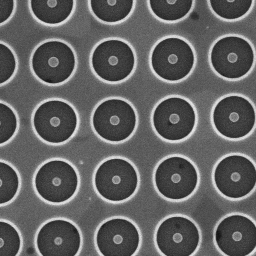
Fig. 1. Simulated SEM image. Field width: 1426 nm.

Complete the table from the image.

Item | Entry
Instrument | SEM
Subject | an array of small figures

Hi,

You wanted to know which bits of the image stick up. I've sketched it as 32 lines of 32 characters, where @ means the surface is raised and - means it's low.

--@@-----@@------@@-----@@------
--@@-----@@@----@@@-----@@@----@
-@@@@---@@@@---@@@@@---@@@@@@@@@
@@@@@@@@@@@@@@@@@@@@@@@@@@@@@@@@
@@@@@@@@@@@@@@@@@@@@@@@@@@@@--@@
-@@@@---@@@@----@@@@----@@@----@
--@@-----@@@-----@@-----@@------
--@@-----@@------@@-----@@------
--@@-----@@------@@-----@@@----@
--@@@----@@@----@@@@---@@@@@---@
@@@@@@-@@@@@@@@@@@@@@@@@@@@@@@@@
@@@@@@@@@@@@@@@@@@@@@@@@@@@@@@@@
@@@@@@-@@@@@@--@@@@@---@@@@----@
-@@@@----@@@-----@@-----@@@-----
--@@------@@-----@@------@@-----
--@@------@@-----@@-----@@@-----
--@@@----@@@-----@@@----@@@----@
-@@@@---@@@@@---@@@@@--@@@@@@@@@
@@@@@@@@@@@@@@@@@@@@@@@@@@@@@@@@
@@@@@@@@@@@@@@@@@@@@@--@@@@@---@
-@@@@----@@@@---@@@@----@@@-----
--@@@-----@@-----@@------@@-----
--@@------@@-----@@------@@-----
--@@------@@-----@@@-----@@-----
--@@@----@@@@---@@@@----@@@@---@
-@@@@@@@@@@@@@@@@@@@@@@@@@@@@@@@
@@@@@@@@@@@@@@@@@@@@@@@@@@@@@@@@
@@@@@@@-@@@@@---@@@@----@@@@---@
--@@@-----@@-----@@@-----@@-----
---@@-----@@-----@@------@@-----
---@@-----@@-----@@------@@-----
--@@@-----@@-----@@@----@@@@----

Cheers